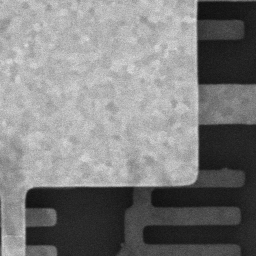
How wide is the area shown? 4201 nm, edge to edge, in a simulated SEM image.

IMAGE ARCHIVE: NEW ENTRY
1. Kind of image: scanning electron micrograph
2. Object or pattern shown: wiring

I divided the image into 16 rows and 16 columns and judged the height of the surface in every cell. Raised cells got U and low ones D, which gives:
UUUUUUUUUUUUDDDD
UUUUUUUUUUUUDDDD
UUUUUUUUUUUUDDDD
UUUUUUUUUUUUDDDD
UUUUUUUUUUUUDDDD
UUUUUUUUUUUUDDDD
UUUUUUUUUUUUDDDD
UUUUUUUUUUUUDDDD
UUUUUUUUUUUUDDDD
UUUUUUUUUUUUDDDD
UUUUUUUUUUUUDDDD
UUUUUUUUUUUUDDDD
UUDDDDDDDDDDDDDD
UUDDDDDDDDDDDDDD
UUDDDDDDDDDDDDDD
UUDDDDDDDDDDDDDD